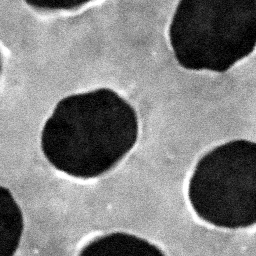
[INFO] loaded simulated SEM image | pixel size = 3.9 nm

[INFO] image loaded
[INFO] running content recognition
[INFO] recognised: holes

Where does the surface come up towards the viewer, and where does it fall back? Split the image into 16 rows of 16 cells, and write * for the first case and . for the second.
**...******.....
***********.....
***********.....
***********....*
****************
****************
****....********
***......*******
***......*******
***.....*****...
***....*****....
************....
.***********....
.***********....
.***************
.****.....******